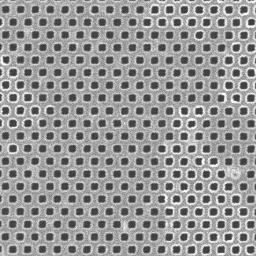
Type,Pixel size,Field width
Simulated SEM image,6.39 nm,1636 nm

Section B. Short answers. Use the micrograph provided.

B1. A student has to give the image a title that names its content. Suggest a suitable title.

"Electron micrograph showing a regular array of holes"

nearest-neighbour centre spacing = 91.1 nm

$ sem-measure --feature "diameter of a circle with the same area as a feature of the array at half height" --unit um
0.0515